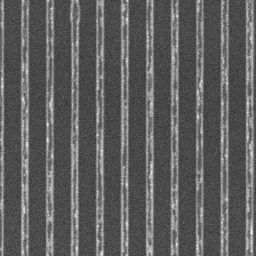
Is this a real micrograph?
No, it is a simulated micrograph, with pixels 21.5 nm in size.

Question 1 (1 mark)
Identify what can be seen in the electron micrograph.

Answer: parallel lines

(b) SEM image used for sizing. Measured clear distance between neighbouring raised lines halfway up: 420 nm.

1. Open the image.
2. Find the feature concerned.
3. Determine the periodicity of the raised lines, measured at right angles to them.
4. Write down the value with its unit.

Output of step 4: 538 nanometres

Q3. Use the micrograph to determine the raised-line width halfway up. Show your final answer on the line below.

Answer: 126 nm